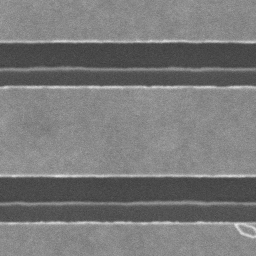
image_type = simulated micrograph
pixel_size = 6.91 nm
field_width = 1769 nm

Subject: lines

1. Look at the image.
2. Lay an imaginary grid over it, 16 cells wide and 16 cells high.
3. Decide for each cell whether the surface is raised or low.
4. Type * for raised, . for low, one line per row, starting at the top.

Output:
****************
****************
****************
................
................
****************
****************
****************
****************
****************
****************
................
................
................
****************
****************